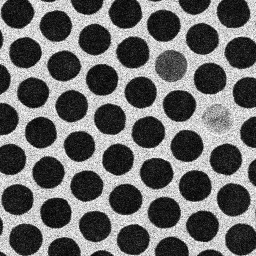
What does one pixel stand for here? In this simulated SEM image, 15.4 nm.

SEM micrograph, a regular array of holes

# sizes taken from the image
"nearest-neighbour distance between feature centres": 0.624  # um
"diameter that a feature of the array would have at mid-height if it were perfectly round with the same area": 32.3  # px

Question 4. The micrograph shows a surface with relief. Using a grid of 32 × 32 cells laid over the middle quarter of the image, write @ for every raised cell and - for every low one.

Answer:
----@@@----@@@@-----@@@--------@
----@@-------@@@@@@@@@@--------@
----@@-------@@@@@@@@@@-------@@
--@@@---------@@@@---@@@-----@@@
@@@@@---------@@------@@@@--@@@@
@@@@@@-------@@--------@@@@@@@@@
@-@@@@-------@@--------@@@@@-@@@
-----@@@----@@@--------@@@------
------@@@@@@@@@--------@@-------
------@@@@@@@@@@------@@@-------
------@@@----@@@@-----@@@-------
------@@-------@@@@@@@@@@-------
-----@@@-------@@@@@@@@@@-------
-----@@---------@@@----@@@------
@--@@@@--------@@@------@@@@@-@@
@@@@@@@@-------@@--------@@@@@@@
@@@@@@@@@------@@--------@@@@@-@
@@----@@@@---@@@@--------@@@----
-------@@@@@@@@@@--------@@-----
--------@@@@@@@@@@------@@@-----
--------@@@-----@@@----@@@@-----
--------@@-------@@@@@@@@@@-----
-------@@@-------@@@@@@@@@@-----
@-----@@@@--------@@@@--@@@@----
@@@--@@@@@-------@@@------@@@@--
@@@@@@@@@@-------@@--------@@@@@
@@@@@@@@@@-------@@--------@@@@@
@@@-----@@@@---@@@@---------@@--
@@-------@@@@@@@@@@--------@@---
@@--------@@@@@@@@@@-------@@---
@---------@@@----@@@@-----@@@---
@@--------@@-------@@@@@@@@@@---